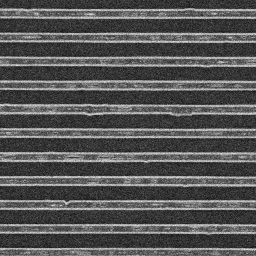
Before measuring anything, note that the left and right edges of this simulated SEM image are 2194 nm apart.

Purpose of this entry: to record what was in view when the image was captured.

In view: parallel lines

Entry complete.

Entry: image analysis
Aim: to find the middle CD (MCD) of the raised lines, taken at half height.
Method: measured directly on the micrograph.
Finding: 68.6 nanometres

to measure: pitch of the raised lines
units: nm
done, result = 205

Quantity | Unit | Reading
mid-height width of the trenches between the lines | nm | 136